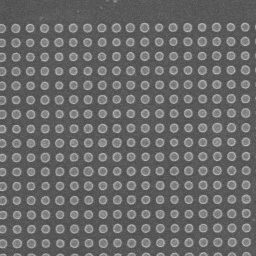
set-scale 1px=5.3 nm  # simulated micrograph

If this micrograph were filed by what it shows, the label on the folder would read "a regular array of raised bodies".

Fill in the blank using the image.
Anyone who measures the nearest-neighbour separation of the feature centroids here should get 75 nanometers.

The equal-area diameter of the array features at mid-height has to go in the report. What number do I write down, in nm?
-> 44.3